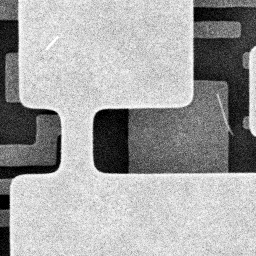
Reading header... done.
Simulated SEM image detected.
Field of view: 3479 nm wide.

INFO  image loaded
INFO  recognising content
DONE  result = wiring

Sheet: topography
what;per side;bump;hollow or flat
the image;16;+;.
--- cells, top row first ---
.+++++++++++....
.+++++++++++....
.+++++++++++....
.+++++++++++....
.+++++++++++....
.+++++++++++....
..++++++++++....
....++..........
....++..........
....++..........
....++..........
.+++++++++++++++
.+++++++++++++++
.+++++++++++++++
.+++++++++++++++
.+++++++++++++++